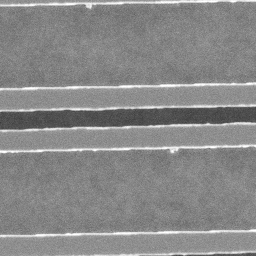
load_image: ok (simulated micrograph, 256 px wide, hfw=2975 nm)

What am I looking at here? lines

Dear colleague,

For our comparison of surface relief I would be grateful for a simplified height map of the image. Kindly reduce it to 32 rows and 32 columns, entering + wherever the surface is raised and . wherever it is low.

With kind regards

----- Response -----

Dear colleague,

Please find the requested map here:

++++++++++......................
................................
................................
................................
................................
................................
................................
................................
................................
................................
.............................+++
++++++++++++++++++++++++++++++++
++++++++++++++++++++++++++++++++
+++++++++++++++.+...............
................................
.........................+++++++
++++++++++++++++++++++++++++++++
++++++++++++++++++++++++++++++++
+++++++++++++++++++++...........
................................
................................
................................
................................
................................
................................
................................
................................
................................
................................
++++++++++++++++++++++++++++++++
++++++++++++++++++++++++++++++++
+++++++++++++++++++++++++++++++.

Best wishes